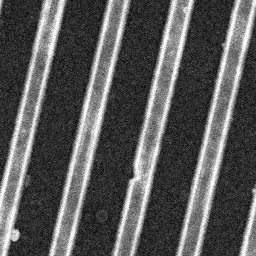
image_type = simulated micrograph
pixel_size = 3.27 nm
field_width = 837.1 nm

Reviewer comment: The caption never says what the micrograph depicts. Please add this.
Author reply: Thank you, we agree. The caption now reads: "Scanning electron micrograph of one or a few lines or trenches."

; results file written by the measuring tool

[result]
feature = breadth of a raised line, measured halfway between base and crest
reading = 0.0517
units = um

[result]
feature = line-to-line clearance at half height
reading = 151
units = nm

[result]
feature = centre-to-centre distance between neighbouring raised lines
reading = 203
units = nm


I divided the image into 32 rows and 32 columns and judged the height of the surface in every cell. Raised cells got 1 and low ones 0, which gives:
00000011000000110000001100000011
00000011000001100000001100000111
00000110000001100000011000000110
00000110000001100000011000000110
00000110000001100000011000000110
00000110000001100000011000001110
00001100000011000000110000001100
00001100000011000000110000001100
00001100000011000000110000001100
00001100000011000000110000001100
00001000000110000001100000011000
00011000000110000001100000011000
00011000000110000001100000011000
00011000000110000001100000011000
00010000000100000001100000111000
00110000001100000011000000110000
00110000001100000011000000110000
00110000001100000011000000110000
00100000001100000011000000110000
01100000011000000110000001100000
01100000011000000110000001100000
01100000011000000110000001100000
01100000011000000110000001100000
01000000110000001100000011000000
11000000110000001100000011000000
11000000110000001100000011000000
11000000110000001100000011000000
10000001100000011100000011000001
10000001100000011000000110000001
10000001100000011000000110000001
10000001100000011000000110000001
10000001100000011000000110000001